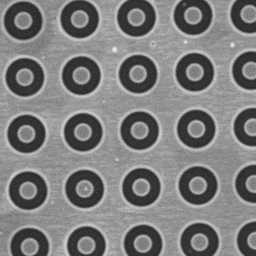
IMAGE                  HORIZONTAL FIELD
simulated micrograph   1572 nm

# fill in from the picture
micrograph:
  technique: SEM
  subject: an array of small figures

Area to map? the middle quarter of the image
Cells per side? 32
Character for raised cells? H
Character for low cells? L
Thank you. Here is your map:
LLLLLLLLLHHHHHLLLLLLLLLHHHHHLLLL
LLLHHHLLLHHHHHLLLHHHLLLHHHHHLLLH
LLHHHHLLLHHHHLLLLHHHLLLLHHHLLLLH
LLHHHHLLLHHHHLLLLHHHLLLLHHHHLLLH
LLLHHHLLLHHHHHLLLLLLLLLHHHHHLLLL
LLLLLLLLLHHHHHLLLLLLLLLHHHHHHLLL
HLLLLLLLHHHHHHHLLLLLLLHHHHHHHHLL
HHLLLLLHHHHHHHHHHHLLHHHHHHHHHHHH
HHHHHHHHHHHHHHHHHHHHHHHHHHHHHHHH
HHHHHHHHHHHHHHHHHHHHHHHHHHHHHHHH
HHHHHHHHHHHHHHHHHHHHHHHHHHHHHHHH
HHHHHHHHHHHHHHHHHHHHHHHHHHHHHHHL
HHHLLLLHHHHHHHHHLLLLLLHHHHHHHHLL
HLLLLLLLHHHHHHHLLLLLLLLHHHHHHLLL
LLLLLLLLLHHHHHLLLLLLLLLLHHHHLLLL
LLLHHHLLLLHHHHLLLHHHLLLLHHHHLLLH
LLLHHHHLLLHHHHLLLHHHHLLLHHHHLLLH
LLLHHHHLLLHHHHLLLHHHHLLLHHHHLLLL
LLLLHHLLLLHHHHLLLLLLLLLLHHHHLLLL
LLLLLLLLLHHHHHHLLLLLLLLHHHHHHLLL
HLLLLLLLHHHHHHHHLLLLLLHHHHHHHHLL
HHLLLLLHHHHHHHHHHHLLHHHHHHHHHHHH
HHHHHHHHHHHHHHHHHHHHHHHHHHHHHHHH
HHHHHHHHHHHHHHHHHHHHHHHHHHHHHHHH
HHHHHHHHHHHHHHHHHHHHHHHHHHHHHHHH
HHHHHHHHHHHHHHHHHHHHHHHHHHHHHHHH
HHHHLLLHHHHHHHHHHLLLLLHHHHHHHHLL
HHLLLLLLLHHHHHHHLLLLLLLHHHHHHLLL
HLLLLLLLLHHHHHHLLLLLLLLLHHHHHLLL
LLLLHHLLLLHHHHLLLLHHHLLLHHHHLLLL
LLLHHHHLLLHHHHLLLHHHHLLLLHHHLLLL
LLLHHHHLLLHHHHLLLLHHHLLLHHHHHLLL